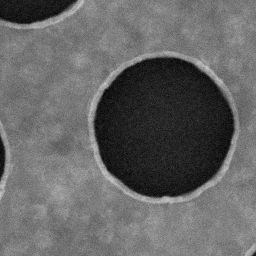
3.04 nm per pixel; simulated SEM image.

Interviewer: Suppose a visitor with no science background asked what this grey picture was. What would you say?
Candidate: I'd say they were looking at holes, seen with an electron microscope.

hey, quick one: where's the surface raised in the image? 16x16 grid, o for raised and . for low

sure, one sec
....oooooooooooo
o.oooooooooooooo
oooooooooooooooo
oooooooooooooooo
oooooooo.....ooo
ooooooo.......oo
oooooo........oo
oooooo.........o
oooooo.........o
oooooo........oo
ooooooo.......oo
oooooooo.....ooo
oooooooooooooooo
oooooooooooooooo
oooooooooooooooo
oooooooooooooooo